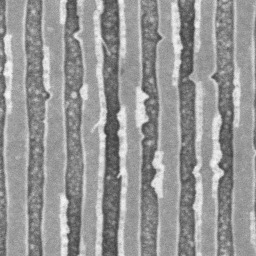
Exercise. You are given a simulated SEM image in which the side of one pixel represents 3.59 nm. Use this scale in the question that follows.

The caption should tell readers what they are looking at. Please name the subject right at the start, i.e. parallel lines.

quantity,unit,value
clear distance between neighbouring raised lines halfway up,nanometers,60.2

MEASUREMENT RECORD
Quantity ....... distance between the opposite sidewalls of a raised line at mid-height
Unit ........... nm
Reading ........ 75.9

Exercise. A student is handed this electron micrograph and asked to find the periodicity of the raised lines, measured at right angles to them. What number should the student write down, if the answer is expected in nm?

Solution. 136